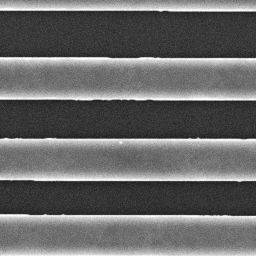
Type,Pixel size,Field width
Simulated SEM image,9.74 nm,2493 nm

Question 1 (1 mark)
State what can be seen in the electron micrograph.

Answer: lines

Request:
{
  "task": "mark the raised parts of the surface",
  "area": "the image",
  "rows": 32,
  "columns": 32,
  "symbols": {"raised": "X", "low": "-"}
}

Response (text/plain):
XXXXXXXXXXXXXXXXXXXXXXXXXXXXXXXX
--------------------------------
--------------------------------
--------------------------------
--------------------------------
--------------------------------
--------------------------------
XXXXXXXXXXXXXXXXXXXXXXXXXXXXXXXX
XXXXXXXXXXXXXXXXXXXXXXXXXXXXXXXX
XXXXXXXXXXXXXXXXXXXXXXXXXXXXXXXX
XXXXXXXXXXXXXXXXXXXXXXXXXXXXXXXX
XXXXXXXXXXXXXXXXXXXXXXXXXXXXXXXX
--------------------------------
--------------------------------
--------------------------------
--------------------------------
--------------------------------
XXXXXXXXXXXXXXXXXXXXXXXXXXXXXXXX
XXXXXXXXXXXXXXXXXXXXXXXXXXXXXXXX
XXXXXXXXXXXXXXXXXXXXXXXXXXXXXXXX
XXXXXXXXXXXXXXXXXXXXXXXXXXXXXXXX
XXXXXXXXXXXXXXXXXXXXXXXXXXXXXXXX
----XXXXXXXXXXXXXXXXXXXXXXXXXXXX
--------------------------------
--------------------------------
--------------------------------
--------------------------------
XXXXXXXXXXXXXXXXXXXXXXXXXXXXXXXX
XXXXXXXXXXXXXXXXXXXXXXXXXXXXXXXX
XXXXXXXXXXXXXXXXXXXXXXXXXXXXXXXX
XXXXXXXXXXXXXXXXXXXXXXXXXXXXXXXX
XXXXXXXXXXXXXXXXXXXXXXXXXXXXXXXX